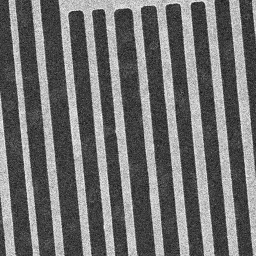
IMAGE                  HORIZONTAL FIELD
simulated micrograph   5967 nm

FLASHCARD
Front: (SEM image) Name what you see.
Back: parallel lines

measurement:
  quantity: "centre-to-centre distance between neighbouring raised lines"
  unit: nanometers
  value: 574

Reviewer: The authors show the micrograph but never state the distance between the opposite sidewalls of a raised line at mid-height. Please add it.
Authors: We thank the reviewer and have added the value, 183 nanometers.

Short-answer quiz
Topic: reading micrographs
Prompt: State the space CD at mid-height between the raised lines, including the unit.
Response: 380 nm